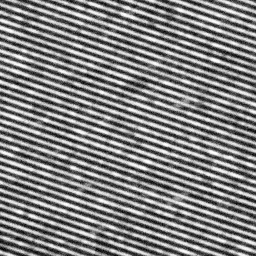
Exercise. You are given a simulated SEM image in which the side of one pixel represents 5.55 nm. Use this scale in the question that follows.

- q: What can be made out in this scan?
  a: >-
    parallel lines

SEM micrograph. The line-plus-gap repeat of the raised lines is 40.8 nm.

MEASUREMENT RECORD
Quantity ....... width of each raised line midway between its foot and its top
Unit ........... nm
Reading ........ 12.5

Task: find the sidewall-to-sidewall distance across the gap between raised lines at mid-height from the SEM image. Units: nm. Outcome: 28.3